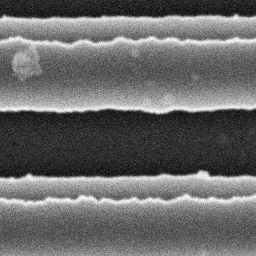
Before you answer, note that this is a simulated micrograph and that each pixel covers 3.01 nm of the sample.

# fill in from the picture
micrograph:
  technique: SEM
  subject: lines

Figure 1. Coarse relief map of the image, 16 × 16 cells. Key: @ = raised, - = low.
----------------
@@@@@@@@@@@@@@@@
@@@@@@@@@@@@@@@@
@@@@@@@@@@@@@@@@
@@@@@@@@@@@@@@@@
@@@@@@@@@@@@@@@@
@@@@@@@@@@@@@@@@
----------------
----------------
----------------
----------------
@@@@@@@@@@@@@@@@
@@@@@@@@@@@@@@@@
@@@@@@@@@@@@@@@@
@@@@@@@@@@@@@@@@
@@@@@@@@@@@@@@@@